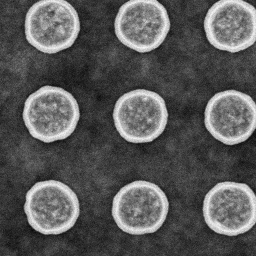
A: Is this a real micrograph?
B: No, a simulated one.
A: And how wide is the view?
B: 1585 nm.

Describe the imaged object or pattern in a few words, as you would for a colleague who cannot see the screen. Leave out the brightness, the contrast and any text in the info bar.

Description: raised bodies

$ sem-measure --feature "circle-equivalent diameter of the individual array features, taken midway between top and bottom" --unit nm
318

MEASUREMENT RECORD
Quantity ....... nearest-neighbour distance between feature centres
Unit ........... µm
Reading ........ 0.551